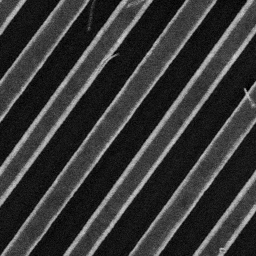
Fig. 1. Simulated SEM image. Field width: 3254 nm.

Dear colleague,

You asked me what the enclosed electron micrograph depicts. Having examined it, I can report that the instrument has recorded lines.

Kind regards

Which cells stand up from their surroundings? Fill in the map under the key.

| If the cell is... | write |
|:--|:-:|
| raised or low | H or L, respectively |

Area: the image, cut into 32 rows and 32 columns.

HHHLLLLHHHHLLLLHHHHLLLLHHHHLLLLH
HHLLLLHHHHLLLLHHHHLLLLHHHHLLLLHH
HLLLLLHHHLLLLLHHHLLLLHHHHLLLLHHH
HLLLLHHHHLLLLHHHLLLLLHHHHLLLLHHH
LLLLHHHHLLLLHHHHLLLLHHHHLLLLHHHH
LLLHHHHLLLLHHHHLLLLHHHHLLLLHHHHL
LLLHHHLLLLLHHHLLLLLHHHLLLLHHHHLL
LLHHHHLLLLHHHHLLLLHHHHLLLLHHHLLL
LHHHHLLLLHHHHLLLLHHHHLLLLHHHHLLL
HHHHLLLLHHHHLLLLHHHHLLLLHHHHLLLL
HHHHLLLLHHHLLLLLHHHLLLLLHHHLLLLL
HHHLLLLHHHLLLLLHHHHLLLLHHHLLLLLH
HHLLLLHHHHLLLLHHHHLLLLHHHHLLLLHH
HLLLLLHHHLLLLHHHHLLLLHHHHLLLLLHH
HLLLLHHHLLLLLHHHLLLLLHHHLLLLLHHH
LLLLHHHHLLLLHHHHLLLLHHHLLLLLHHHH
LLLHHHHLLLLHHHHLLLLHHHHLLLLHHHHL
LLLHHHLLLLLHHHLLLLHHHHLLLLLHHHLL
LLHHHLLLLLHHHLLLLLHHHLLLLLHHHHLL
LHHHHLLLLHHHHLLLLHHHHLLLLHHHHLLL
HHHHLLLLHHHHLLLLHHHHLLLLHHHHLLLL
HHHLLLLLHHHLLLLLHHHLLLLLHHHLLLLL
HHLLLLLHHHHLLLLHHHLLLLLHHHHLLLLH
HHLLLLHHHHLLLLHHHHLLLLHHHHLLLLHH
HLLLLHHHHLLLLHHHHLLLLLHHHLLLLLHH
LLLLLHHHLLLLLHHHLLLLLHHHLLLLLHHH
LLLLHHHHLLLLHHHLLLLLHHHHLLLLHHHH
LLLHHHHLLLLHHHHLLLLHHHHLLLLHHHHL
LLLHHHLLLLHHHHLLLLLHHHLLLLLHHHLL
LLHHHLLLLLHHHLLLLLHHHHLLLLHHHHLL
LHHHHLLLLHHHLLLLLHHHHLLLLHHHHLLL
HHHHLLLLHHHHLLLLHHHHLLLLLHHHLLLL